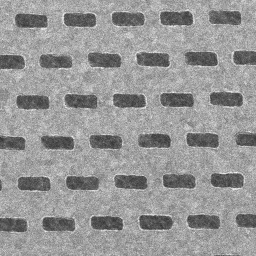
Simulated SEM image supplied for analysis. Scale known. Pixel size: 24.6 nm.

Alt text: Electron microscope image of a regular array of holes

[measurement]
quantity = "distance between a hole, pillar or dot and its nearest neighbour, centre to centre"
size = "47.1 px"